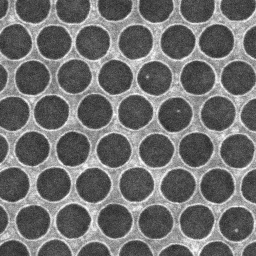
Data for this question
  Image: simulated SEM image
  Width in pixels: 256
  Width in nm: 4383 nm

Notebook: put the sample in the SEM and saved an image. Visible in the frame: a regular array of holes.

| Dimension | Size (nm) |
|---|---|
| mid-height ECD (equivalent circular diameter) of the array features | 602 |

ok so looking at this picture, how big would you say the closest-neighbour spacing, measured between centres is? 678 nm